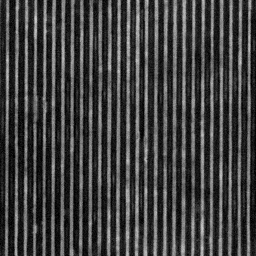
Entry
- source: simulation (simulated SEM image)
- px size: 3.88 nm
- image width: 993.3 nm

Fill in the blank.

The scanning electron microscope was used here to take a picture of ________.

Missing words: parallel lines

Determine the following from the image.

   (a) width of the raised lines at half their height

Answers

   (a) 9.7 nanometers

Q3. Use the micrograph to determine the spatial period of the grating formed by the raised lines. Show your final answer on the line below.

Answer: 36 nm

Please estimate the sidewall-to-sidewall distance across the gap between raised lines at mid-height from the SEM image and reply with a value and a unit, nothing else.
0.0262 microns